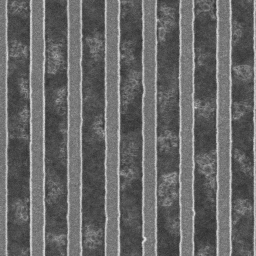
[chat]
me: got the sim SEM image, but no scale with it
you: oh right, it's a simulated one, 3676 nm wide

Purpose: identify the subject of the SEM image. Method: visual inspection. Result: parallel lines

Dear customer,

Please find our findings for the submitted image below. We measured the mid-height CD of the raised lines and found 13.9 pixels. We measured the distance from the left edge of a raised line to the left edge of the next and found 535 nanometres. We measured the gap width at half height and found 343 nm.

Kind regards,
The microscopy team